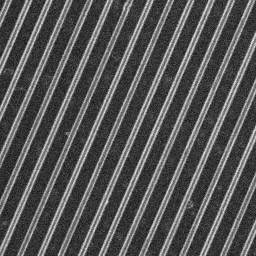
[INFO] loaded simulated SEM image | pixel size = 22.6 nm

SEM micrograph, parallel lines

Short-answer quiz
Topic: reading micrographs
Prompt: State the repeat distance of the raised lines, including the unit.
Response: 0.42 microns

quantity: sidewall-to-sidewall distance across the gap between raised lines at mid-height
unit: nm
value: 324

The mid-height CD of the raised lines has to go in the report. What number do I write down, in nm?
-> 106